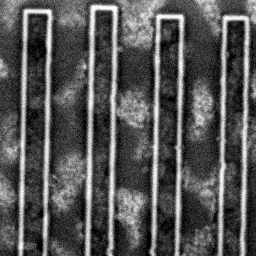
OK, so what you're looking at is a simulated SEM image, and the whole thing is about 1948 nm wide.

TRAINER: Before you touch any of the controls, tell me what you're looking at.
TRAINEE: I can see one or a few lines or trenches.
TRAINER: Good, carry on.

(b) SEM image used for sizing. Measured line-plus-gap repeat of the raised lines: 504 nanometres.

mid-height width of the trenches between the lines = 327 nm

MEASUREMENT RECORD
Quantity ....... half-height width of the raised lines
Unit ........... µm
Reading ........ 0.176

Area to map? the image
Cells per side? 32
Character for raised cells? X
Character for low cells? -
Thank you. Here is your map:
--------------------------------
---XXX------XX------------------
---XXX------XX------XXX-----XXX-
---XXX------XX------XXX-----XXX-
---XXX------XX------XXX-----XXX-
---XXX------XX------XXX-----XXX-
---XXX------XX------XXX-----XXX-
---XXX-----XXX------XXX-----XXX-
---XXX-----XXX------XXX-----XXX-
---XXX-----XXX------XXX-----XXX-
---XXX-----XXX------XX------XXX-
---XXX-----XXX------XX------XXX-
---XXX-----XXX------XX------XXX-
---XXX-----XXX------XX------XXX-
---XXX-----XXX------XX------XXX-
---XXX-----XXX------XX------XXX-
---XXX-----XXX------XX------XXX-
---XXX-----XXX------XX------XXX-
---XXX-----XXX-----XXX------XX--
---XXX-----XXX------XX------XXX-
---XXX-----XXX-----XXX------XXX-
---XXX-----XXX-----XXX------XXX-
---XXX-----XXX-----XXX------XXX-
---XXX-----XXX-----XXX------XX--
---XXX-----XXX-----XXX------XX--
---XXX-----XXX-----XXX------XX--
---XXX-----XXX-----XXX------XX--
---XXX-----XXX-----XXX------XX--
---XXX-----XXX-----XXX------XX--
---XXX-----XXX-----XXX------XX--
---XXX-----XXX-----XXX------XX--
---XXX-----XXX-----XXX------XX--